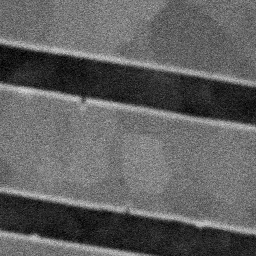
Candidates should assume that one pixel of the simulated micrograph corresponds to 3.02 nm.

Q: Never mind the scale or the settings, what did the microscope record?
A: one or a few lines or trenches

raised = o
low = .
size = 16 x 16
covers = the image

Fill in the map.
oooooooooooooooo
oooooooooooooooo
oooooooooooooooo
......oooooooooo
............oooo
o...............
ooooooo.........
oooooooooooo....
oooooooooooooooo
oooooooooooooooo
oooooooooooooooo
oooooooooooooooo
....oooooooooooo
..........oooooo
................
oooooo..........